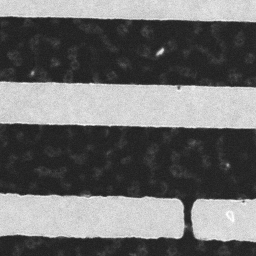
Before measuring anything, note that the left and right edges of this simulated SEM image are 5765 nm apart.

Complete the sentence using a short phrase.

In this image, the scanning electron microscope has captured one or a few lines or trenches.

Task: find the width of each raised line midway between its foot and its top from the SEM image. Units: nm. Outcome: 1510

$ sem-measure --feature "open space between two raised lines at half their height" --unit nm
895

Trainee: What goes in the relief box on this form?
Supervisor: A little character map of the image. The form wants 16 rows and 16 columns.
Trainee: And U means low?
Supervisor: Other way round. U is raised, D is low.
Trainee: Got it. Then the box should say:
DDDDDDDDDDDDDDDD
UUUUUUUUUUUUUUUU
UUUUUUUUUUUUUUUU
UUUUUUUUUUUUUUUU
UUUUUUUUUUUUUUUU
DDDDDDDDDDDDDDDD
DDDDDDDDDDDDDDDD
DDDDDDDDDDDDDDDD
UUUUUUUUUUUUUUUU
UUUUUUUUUUUUUUUU
UUUUUUUUUUUUUUUU
UUUUUUUUUUUUUUUU
DDDDDDDDDDDUUUUU
DDDDDDDDDDDUDDDD
DDDDDDDDDDDUDDDD
UUUUUUUUUUUUUUUU